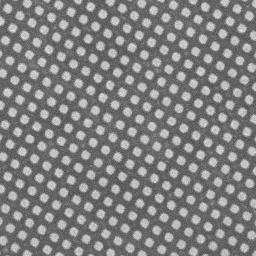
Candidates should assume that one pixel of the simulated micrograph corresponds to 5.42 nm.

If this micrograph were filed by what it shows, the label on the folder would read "a regular array of raised bodies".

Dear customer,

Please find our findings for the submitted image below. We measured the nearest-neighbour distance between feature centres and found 76.3 nanometers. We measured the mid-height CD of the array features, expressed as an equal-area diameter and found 45.4 nm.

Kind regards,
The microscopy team